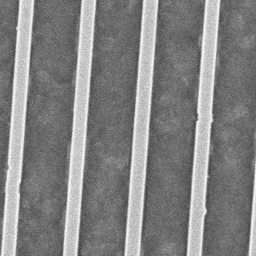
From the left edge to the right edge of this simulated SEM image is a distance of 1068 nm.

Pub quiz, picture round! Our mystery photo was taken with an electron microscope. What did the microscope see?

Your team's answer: parallel lines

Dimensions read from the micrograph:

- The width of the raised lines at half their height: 56.1 nm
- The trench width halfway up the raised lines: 200 nm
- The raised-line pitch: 258 nm